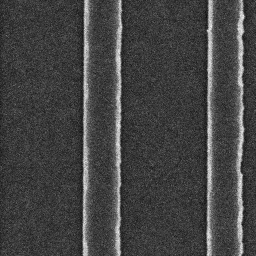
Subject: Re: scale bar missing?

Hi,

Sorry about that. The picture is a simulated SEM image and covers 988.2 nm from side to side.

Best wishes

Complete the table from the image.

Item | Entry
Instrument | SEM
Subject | one or a few lines or trenches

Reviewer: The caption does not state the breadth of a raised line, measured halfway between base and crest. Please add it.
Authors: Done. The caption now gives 134 nm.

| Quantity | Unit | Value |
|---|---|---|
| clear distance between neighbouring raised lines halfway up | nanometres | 340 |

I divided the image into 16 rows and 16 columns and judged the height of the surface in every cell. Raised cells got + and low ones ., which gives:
.....+++.....++.
.....+++.....++.
.....+++.....++.
.....+++.....++.
.....+++.....++.
.....+++.....++.
.....+++.....++.
.....+++.....++.
.....++......++.
.....++......++.
.....++......++.
.....++......++.
.....++......++.
.....++......++.
.....++......++.
.....++......++.